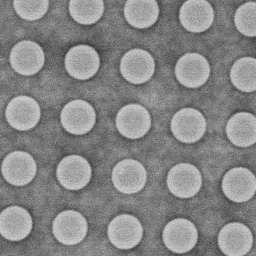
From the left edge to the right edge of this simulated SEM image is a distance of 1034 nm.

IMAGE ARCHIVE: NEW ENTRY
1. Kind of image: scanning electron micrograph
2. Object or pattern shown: an array of small figures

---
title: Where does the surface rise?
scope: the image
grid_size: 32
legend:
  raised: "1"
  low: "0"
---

00111100011110001111000111000001
00111100011110001111001111100011
00000000011100001110000111100111
00000000000000000000000111000011
00000000000000000000000000000001
00111000000000000000000000000000
01111000011100001100000000000000
01111000111100011110001111000011
00111000111100011110001111000111
00000000011000011110001111000111
00000000000000000000000110000111
00000000000000000000000000000000
00110000000000000000000000000000
01111000111100011100000000000000
01111000111100011110001110000111
01110000111100011110011111001111
00000000011000011100001111001111
00000000000000000000001110000111
00000000000000000000000000000000
01110000010000000000000000000000
11110001111000011100000100000000
11110001111000111100011110000110
01110001111000111100011110001111
00000000110000011100011110001111
00000000000000000000001100001110
00000000000000000000000000000000
11100000110000000000000000000000
11110001111000111000001000000000
11110001111000111100011100001110
11100001111000111100111110011110
00000000100000111000011100011110
00000000000000000000001000001110